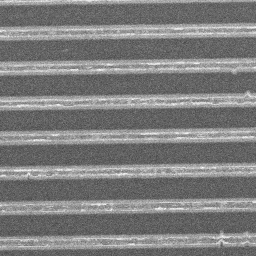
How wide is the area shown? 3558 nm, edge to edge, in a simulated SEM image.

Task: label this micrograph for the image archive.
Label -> parallel lines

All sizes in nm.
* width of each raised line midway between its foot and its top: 125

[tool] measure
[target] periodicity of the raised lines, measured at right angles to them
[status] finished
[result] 486 nm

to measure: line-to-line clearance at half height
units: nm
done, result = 360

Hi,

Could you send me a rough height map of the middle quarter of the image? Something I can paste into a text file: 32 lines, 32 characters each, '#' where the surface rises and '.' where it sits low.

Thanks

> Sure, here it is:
################################
############################....
................................
................................
................................
................................
................................
................................
.........#######################
################################
######################..##......
................................
................................
................................
................................
................................
................................
################################
################################
................................
................................
................................
................................
................................
................................
................................
################################
################################
................................
................................
................................
................................